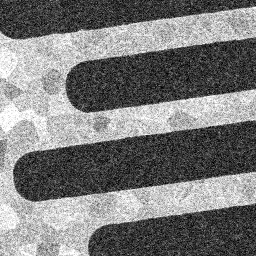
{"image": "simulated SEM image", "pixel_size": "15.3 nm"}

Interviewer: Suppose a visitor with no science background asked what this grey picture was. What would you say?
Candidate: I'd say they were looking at one or a few lines or trenches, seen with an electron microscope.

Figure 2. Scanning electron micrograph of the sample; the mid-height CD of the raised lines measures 446 nm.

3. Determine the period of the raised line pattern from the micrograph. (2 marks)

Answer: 1.26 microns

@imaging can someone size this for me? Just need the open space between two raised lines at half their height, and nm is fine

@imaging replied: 803